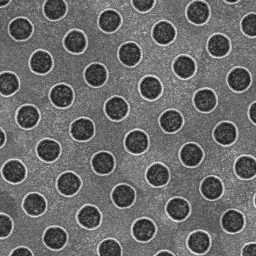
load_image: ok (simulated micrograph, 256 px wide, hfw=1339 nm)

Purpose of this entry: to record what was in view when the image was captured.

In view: a regular array of holes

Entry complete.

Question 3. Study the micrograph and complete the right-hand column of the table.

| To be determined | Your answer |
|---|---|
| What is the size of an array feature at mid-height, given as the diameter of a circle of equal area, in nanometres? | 126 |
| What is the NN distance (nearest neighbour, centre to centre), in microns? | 0.205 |